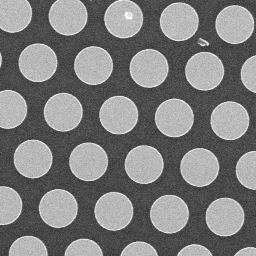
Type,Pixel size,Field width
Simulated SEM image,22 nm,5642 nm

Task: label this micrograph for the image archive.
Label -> an array of small figures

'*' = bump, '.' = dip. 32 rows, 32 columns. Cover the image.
****...***....***.....*.........
****..*****..*****..****....***.
****..*****..*****..*****..*****
***....***...*****..*****..*****
..............***....***....***.
................................
...****...***.....**............
..*****..*****...****...***....*
...****..*****..*****..*****..**
...***....****..*****..*****..**
...........*.....***....***...**
**..............................
***...****...***.....**.........
***...****...****...****...***..
***...****..*****..*****..*****.
***...****...****...****..*****.
..............**....***....****.
................................
..****...****....**.............
..****...****...****...****...**
..****...****...****...****...**
..****...****...****...****...**
..........**.....**....****...**
*..............................*
**....***....***.....*..........
***..*****..****...****...****..
***..*****..*****..*****..****..
**...****...****...****...****..
.............**.....***...****..
................................
..***....***....***.............
.*****..*****..*****...***....**